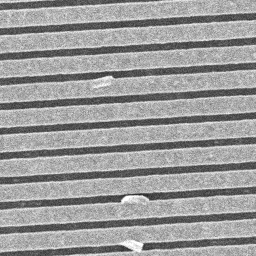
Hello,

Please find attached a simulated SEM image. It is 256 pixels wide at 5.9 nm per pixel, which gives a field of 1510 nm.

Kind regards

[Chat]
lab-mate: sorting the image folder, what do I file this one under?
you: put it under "parallel lines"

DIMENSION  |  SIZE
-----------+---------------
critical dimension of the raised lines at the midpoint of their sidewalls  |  0.102 microns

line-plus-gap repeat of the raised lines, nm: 146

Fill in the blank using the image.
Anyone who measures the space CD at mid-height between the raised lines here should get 43.4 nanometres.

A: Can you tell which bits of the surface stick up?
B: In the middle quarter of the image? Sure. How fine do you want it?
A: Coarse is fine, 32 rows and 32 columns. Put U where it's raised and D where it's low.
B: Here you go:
UUUUUUUUUUUUUUUUUUUUUUUUUUUUUUUD
UUUUUUUUUUUUUUDDDDDDDDDDDDDDDDDD
DDDDDDDDDDDDDDDDDDDDDDDDDDDDDDDD
DDDDDDDDDUUUDDDUUUUUUUUUUUUUUUUU
UUUUUUUUUUUUUUUUUUUUUUUUUUUUUUUU
UUUUUUUUUUUUUUUUUUUUUUUUUUUUUUUU
UUUUUUUUUUUUUUUUUUUUUUUUUUUUUUUU
UUUUUUUUUUUUUUUUUUUUDDDDDDDDDDDD
DDDUDDDDDDDDDDDDDDDDDDDDDDDDDDDD
DDDDDDDDDDDDDDDDDDUDDUUUUUUUUUUU
DDUDDUUUUUUUUUUUUUUUUUUUUUUUUUUU
UUUUUUUUUUUUUUUUUUUUUUUUUUUUUUUU
UUUUUUUUUUUUUUUUUUUUUUUUUUUUUUUU
UUUUUUUUUUUUUUUUUUUUUUUDDDDDDDDD
UUUUUUDDDDDDDDDDDDDDDDDDDDDDDDDD
DDDDDDDDDDDDDDDDDDDDDDDDUUUUUUUU
DDDDDDDUUUUUUUUUUUUUUUUUUUUUUUUU
UUUUUUUUUUUUUUUUUUUUUUUUUUUUUUUU
UUUUUUUUUUUUUUUUUUUUUUUUUUUUUUUU
UUUUUUUUUUUUUUUUUUUUUUUUUDDDDDDD
UUUUUUUUUDDDDDDDDDDDDDDDDDDDDDDD
DDDDDDDDDDDDDDDDDDDDDDDDDDUUUUUU
DDDDDDDDDDUUUUUUUUUUUUUUUUUUUUUU
UUUUUUUUUUUUUUUUUUUUUUUUUUUUUUUU
UUUUUUUUUUUUUUUUUUUUUUUUUUUUUUUU
UUUUUUUUUUUUUUUUUUUUUUUUUUUUDDDD
UUUUUUUUUUUUDDDDDDDDDDDDDDDDDDDD
DDDDDDDDDDDDDDDDDDDDDDDDDDDDDUUU
DDDDDDDDDDDDDUDDUUUUUUUUUUUUUUUU
UUUUUUUUUUUUUUUUUUUUUUUUUUUUUUUU
UUUUUUUUUUUUUUUUUUUUUUUUUUUUUUUU
UUUUUUUUUUUUUUUUUUUUUUUUUUUUUUUD